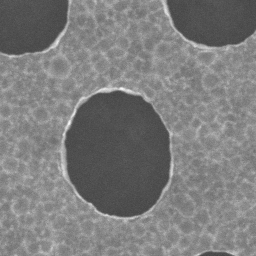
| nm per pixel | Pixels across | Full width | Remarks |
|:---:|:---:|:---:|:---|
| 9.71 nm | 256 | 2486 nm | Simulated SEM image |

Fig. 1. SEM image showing holes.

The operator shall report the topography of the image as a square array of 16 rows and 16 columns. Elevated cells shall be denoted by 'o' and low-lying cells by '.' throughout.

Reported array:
....oooooo......
....ooooooo.....
...ooooooooo...o
oooooooooooooooo
oooooooooooooooo
oooooooooooooooo
ooooo....ooooooo
oooo......oooooo
oooo.......ooooo
oooo.......ooooo
oooo.......ooooo
oooo......oooooo
ooooo.....oooooo
ooooooo.oooooooo
oooooooooooooooo
oooooooooooooooo